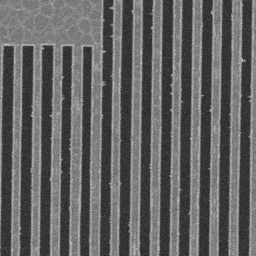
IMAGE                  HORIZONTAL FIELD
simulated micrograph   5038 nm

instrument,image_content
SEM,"parallel lines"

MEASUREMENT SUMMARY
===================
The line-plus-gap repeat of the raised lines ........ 391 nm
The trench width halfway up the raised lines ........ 234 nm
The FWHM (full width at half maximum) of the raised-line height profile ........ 7.75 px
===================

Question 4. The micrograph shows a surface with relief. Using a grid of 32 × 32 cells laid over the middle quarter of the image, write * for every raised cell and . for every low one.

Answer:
..**...**....*...**...**...**...
..**...**....*...**...**...**...
..**...**...**...**...**...**...
..**...**...**...**...**...**...
..**...***..**...**...**...**...
..**...***..**...**...**...**...
..***..**...**...**...**...**...
..***..**...**...**...**...**...
..***..**...**...**...**...**...
..***..**...**...**...**...**...
..**...**...**...**...**...**...
..**...**...**...**...**...**...
..**...**...**...**...**...**...
..**...***..**...**...**...**...
..**...**...**...**...**...**...
..**...**...**...**...**...**...
..**...**...**...**...**...**...
..**...**...**...**...**...**...
..**...**...**...**...**...**...
..**...**...**...**...**...**...
..**...**...**...**...**...**...
..**...**...**...**...**...**...
..***..**...**...**...**...**...
..**...**...**...**...**...**...
..**...**...**...**...**...**...
..**...**...**...**...**...**...
..**..***...**...**...**...**...
..**...**...**...**...**...**...
..**...**...**...**...**...**...
..**...**...**...**...**...**...
..**...**...**...**...**...**...
..**...**...**...**...**...**...